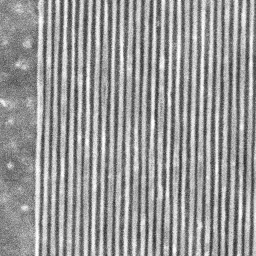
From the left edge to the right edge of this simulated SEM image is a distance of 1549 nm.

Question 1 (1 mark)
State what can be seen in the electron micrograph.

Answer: parallel lines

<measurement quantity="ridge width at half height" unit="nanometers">21.2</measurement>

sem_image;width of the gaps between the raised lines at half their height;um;0.0265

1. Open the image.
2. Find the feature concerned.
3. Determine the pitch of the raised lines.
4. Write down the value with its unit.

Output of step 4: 48.9 nanometres